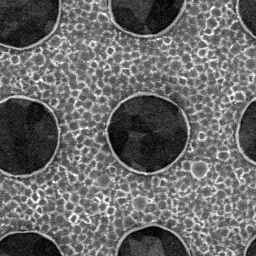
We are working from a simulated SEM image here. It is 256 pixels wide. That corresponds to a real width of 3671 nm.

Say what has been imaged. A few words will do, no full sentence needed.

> raised bodies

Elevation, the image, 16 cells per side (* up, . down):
****...****....*
****...****....*
***.............
................
................
................
***.....***.....
****...*****...*
****...*****...*
***....****....*
***.....**......
................
................
................
.*......***.....
****...*****...*